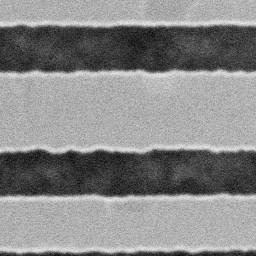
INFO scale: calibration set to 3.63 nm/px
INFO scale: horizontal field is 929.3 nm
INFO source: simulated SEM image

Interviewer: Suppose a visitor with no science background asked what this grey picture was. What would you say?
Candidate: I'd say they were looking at lines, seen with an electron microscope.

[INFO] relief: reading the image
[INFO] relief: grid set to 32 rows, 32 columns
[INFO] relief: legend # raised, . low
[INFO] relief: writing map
################################
################################
################################
................................
................................
................................
................................
................................
................................
################################
################################
################################
################################
################################
################################
################################
################################
################################
################################
................................
................................
................................
................................
................................
...........#..........##..####.#
################################
################################
################################
################################
################################
################################
..###....#...#..#.......#.......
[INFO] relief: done